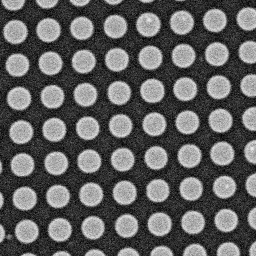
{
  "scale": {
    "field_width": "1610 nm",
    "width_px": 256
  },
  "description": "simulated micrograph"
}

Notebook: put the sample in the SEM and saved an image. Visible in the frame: an array of small figures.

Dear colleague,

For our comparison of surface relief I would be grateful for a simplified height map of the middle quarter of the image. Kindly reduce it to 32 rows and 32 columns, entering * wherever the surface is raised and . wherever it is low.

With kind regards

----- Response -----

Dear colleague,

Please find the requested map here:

..*****....****.....****.....**.
...****.....**..................
................................
................................
....................****....****
....***.....****...******...****
...*****...*****...******...****
...*****...*****...******...****
...*****...*****....****.....***
...****.....***......*..........
................................
................................
......................**.....***
.....**.....****....*****...****
....****....*****...*****...****
...******..******...*****...****
...******...*****...*****....***
....****....****.....***........
.....**.........................
................................
..............................**
.............***.....****....***
....****....*****...******...***
*...*****...*****...******...***
*...*****...*****....****....***
*...*****...*****....****.....**
.....***......**................
................................
................................
..............**......***.....**
.....****....****....*****...***
*...*****....*****...*****...***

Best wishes